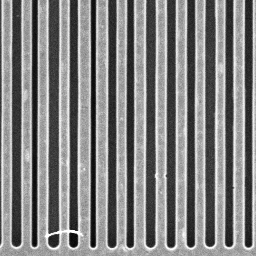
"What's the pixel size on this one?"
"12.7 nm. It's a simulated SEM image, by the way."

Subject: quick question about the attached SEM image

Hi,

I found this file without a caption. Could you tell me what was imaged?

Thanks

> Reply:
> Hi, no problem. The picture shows parallel lines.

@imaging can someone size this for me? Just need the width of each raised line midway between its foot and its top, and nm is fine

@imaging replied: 132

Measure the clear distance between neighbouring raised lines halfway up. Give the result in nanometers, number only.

121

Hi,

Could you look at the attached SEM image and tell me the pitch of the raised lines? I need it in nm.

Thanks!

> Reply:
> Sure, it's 246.